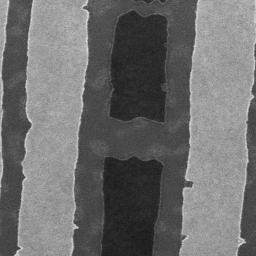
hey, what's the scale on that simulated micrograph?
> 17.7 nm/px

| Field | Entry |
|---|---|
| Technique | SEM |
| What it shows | one or a few lines or trenches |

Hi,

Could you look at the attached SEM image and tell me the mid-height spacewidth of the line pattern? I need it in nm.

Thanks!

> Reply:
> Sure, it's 447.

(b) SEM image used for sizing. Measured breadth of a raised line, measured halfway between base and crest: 1010 nm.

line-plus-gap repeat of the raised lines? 1470 nm